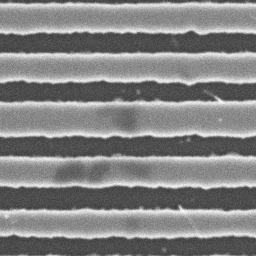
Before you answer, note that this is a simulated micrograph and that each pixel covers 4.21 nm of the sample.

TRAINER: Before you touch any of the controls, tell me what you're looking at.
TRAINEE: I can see lines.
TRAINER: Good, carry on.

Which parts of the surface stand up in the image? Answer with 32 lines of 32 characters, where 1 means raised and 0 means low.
11111111111110011111111111111111
11111111111111111111111111111111
11111111111111111111111111111111
11111111111111111111111111111111
00000000000000000000000000000000
00000000000000000000000000000000
00000000000000000000000000000000
11111111111111111111111111111111
11111111111111111111111111111111
11111111111111111111111111111111
00000000000000000000000100000000
00000000000000000000000000000000
00000000000000000000000000000000
11111111111111111111111111111111
11111111111111111111111111111111
11111111111111111111111111111111
11111111111111111111111111111111
00000000000000000000000000000000
00000000000000000000000000000000
00000000000000000000000000001000
11111111111111111111111111111111
11111111111111111111111111111111
11111111111111111111111111111111
00000000000010000000010001100000
00000000000000000000000000000000
00000000000000000000000000000000
11111111111111111111111111111111
11111111111111111111111111111111
11111111111111111111111111111111
10111111111111111111111111111111
00000000000000000000000000000000
00000000000000000000000000000000